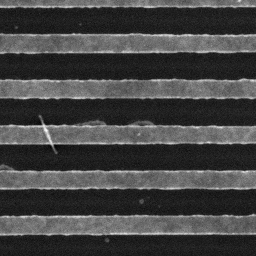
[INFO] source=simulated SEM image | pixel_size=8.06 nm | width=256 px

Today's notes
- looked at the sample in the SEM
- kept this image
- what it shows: lines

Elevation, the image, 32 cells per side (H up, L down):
HHHHHHHHHHHHHHHHHHHHHHHHHHHHHHHH
LLLLLLLLLLLLLLLLLLLLLLLLLLLLLLLL
LLLLLLLLLLLLLLLLLLLLLLLLLLLLLLLL
LLLLLLLLLLLLLLLLLLLLLLLLLLLLLLLL
HHHHHHHHHHHHHHHHHHHHHHHHHHHHHHHH
HHHHHHHHHHHHHHHHHHHHHHHHHHHHHHHH
HHHHHHHHHHHHHHHHHHHHHHHLHHLHHHLL
LLLLLLLLLLLLLLLLLLLLLLLLLLLLLLLL
LLLLLLLLLLLLLLLLLLLLLLLLLLLLLLLL
LLLLLLLLLLLLLLLLLLLLLLLLLLLLLLLL
HHHHHHHHHHHHHHHHHHHHHHHHHHHHHHHH
HHHHHHHHHHHHHHHHHHHHHHHHHHHHHHHH
LLLLLLLLLLLLLLLLLLLLLLLLLLLLLLLL
LLLLLLLLLLLLLLLLLLLLLLLLLLLLLLLL
LLLLLLLLLLLLLLLLLLLLLLLLLLLLLLLL
LLLLLLLLLLLLLLLLLLLLLLLLLLLLLLLL
HHHHHHHHHHHHHHHHHHHHHHHHHHHHHHHH
HHHHHHHHHHHHHHHHHHHHHHHHHHHHHHHH
LLLLLLLLLLLLLLLLLLLLLLLLLLLLLLLL
LLLLLLLLLLLLLLLLLLLLLLLLLLLLLLLL
LLLLLLLLLLLLLLLLLLLLLLLLLLLLLLLL
HHHHHHHHHHHHHHHHHHHHHHHHHHHHHHHH
HHHHHHHHHHHHHHHHHHHHHHHHHHHHHHHH
HHHHLHHHHHHLHHLHLHHHHHHLLHHHHHHH
LLLLLLLLLLLLLLLLLLLLLLLLLLLLLLLL
LLLLLLLLLLLLLLLLLLLLLLLLLLLLLLLL
LLLLLLLLLLLLLLLLLLLLLLLLLLLLLLLL
HHHHHHHHHHHHHHHHHHHHHHHHHHHHHHHH
HHHHHHHHHHHHHHHHHHHHHHHHHHHHHHHH
LLLLLLLLLLLLLLLLLLLLLLLLLLLLLLLL
LLLLLLLLLLLLLLLLLLLLLLLLLLLLLLLL
LLLLLLLLLLLLLLLLLLLLLLLLLLLLLLLL